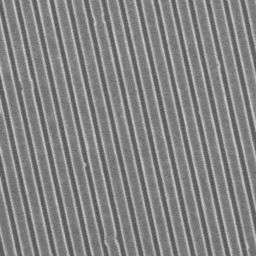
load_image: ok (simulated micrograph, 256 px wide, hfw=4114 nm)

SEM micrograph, parallel lines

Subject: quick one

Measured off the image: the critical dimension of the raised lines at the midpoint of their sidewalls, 175 nm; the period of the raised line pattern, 273 nm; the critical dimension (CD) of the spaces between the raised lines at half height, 94.3 nanometers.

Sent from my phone